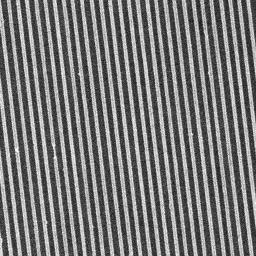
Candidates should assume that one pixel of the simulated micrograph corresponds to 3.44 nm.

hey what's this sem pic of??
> parallel lines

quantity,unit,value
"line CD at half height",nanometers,9.4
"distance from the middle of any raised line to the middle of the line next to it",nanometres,31.6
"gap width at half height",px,6.19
